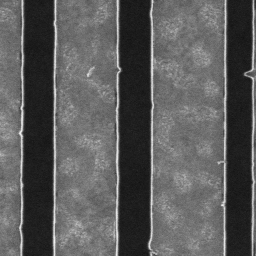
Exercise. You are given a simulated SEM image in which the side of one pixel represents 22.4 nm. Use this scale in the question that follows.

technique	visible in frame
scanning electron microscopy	one or a few lines or trenches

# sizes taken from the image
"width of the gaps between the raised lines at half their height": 1.5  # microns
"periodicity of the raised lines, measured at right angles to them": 2240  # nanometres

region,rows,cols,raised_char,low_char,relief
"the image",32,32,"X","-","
---XXXX--------XXXX---------XXXX
---XXXX--------XXXX---------XXXX
---XXXX--------XXXX---------XXXX
---XXXX--------XXXX---------XXXX
---XXXX--------XXXX---------XXXX
---XXXX--------XXXX---------XXXX
---XXXX--------XXXX---------XXXX
---XXXX--------XXXX---------XXXX
---XXXX--------XXXX---------XXXX
---XXXX--------XXXX---------XXX-
---XXXX--------XXXX---------XXXX
---XXXX--------XXXX---------XXXX
---XXXX--------XXXX---------XXXX
---XXXX--------XXXX---------XXXX
---XXXX--------XXXX---------XXXX
---XXXX--------XXXX---------XXXX
---XXXX--------XXXX---------XXXX
---XXXX--------XXXX---------XXXX
---XXXX--------XXXX---------XXXX
---XXXX--------XXXX---------XXXX
---XXXX--------XXXX---------XXXX
---XXXX--------XXXX---------XXXX
---XXXX--------XXXX---------XXXX
---XXXX--------XXXX---------XXXX
---XXXX--------XXXX---------XXXX
---XXXX--------XXXX---------XXXX
---XXXX--------XXXX---------XXXX
---XXXX--------XXXX---------XXXX
---XXXX--------XXXX---------XXXX
---XXXX--------XXXX---------XXXX
---XXXX--------XXXX---------XXXX
---XXXX--------XXXX---------XXXX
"